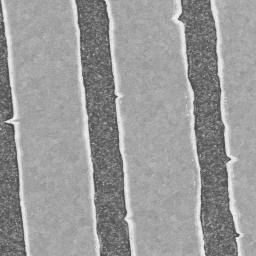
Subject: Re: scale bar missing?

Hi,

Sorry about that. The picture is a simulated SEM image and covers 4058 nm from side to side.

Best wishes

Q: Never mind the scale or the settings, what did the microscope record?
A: one or a few lines or trenches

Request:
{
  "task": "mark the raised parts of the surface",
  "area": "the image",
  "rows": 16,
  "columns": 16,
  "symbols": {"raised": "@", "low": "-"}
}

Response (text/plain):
@@@@@--@@@@--@@@
@@@@@--@@@@---@@
-@@@@--@@@@---@@
-@@@@--@@@@@--@@
-@@@@--@@@@@--@@
-@@@@--@@@@@--@@
-@@@@--@@@@@--@@
-@@@@--@@@@@--@@
-@@@@---@@@@--@@
-@@@@@--@@@@--@@
-@@@@@--@@@@--@@
-@@@@@--@@@@@-@@
-@@@@@--@@@@--@@
-@@@@@--@@@@---@
--@@@@--@@@@@--@
--@@@@--@@@@@--@